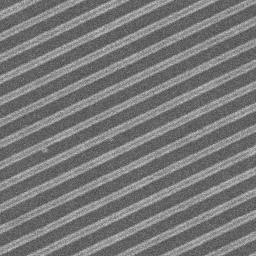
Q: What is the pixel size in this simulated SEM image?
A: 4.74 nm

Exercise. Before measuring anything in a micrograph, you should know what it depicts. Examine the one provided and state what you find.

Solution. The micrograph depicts parallel lines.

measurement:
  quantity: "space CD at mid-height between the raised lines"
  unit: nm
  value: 61.3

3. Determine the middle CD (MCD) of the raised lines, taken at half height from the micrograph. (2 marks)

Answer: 0.0278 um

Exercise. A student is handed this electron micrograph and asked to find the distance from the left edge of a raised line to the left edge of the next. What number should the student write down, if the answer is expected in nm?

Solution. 91.5